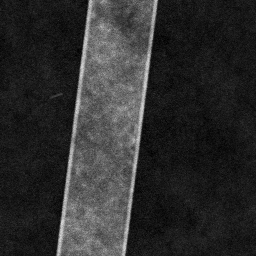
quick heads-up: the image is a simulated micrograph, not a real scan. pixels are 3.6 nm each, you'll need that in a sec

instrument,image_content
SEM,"one or a few lines or trenches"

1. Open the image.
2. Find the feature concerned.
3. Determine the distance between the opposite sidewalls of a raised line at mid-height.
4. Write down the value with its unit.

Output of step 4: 0.238 µm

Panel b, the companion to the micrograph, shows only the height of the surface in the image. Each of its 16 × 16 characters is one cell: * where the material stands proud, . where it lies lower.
......****......
.....*****......
.....****.......
.....****.......
.....****.......
.....****.......
.....****.......
.....****.......
.....****.......
....*****.......
....****........
....****........
....****........
....****........
....****........
....****........